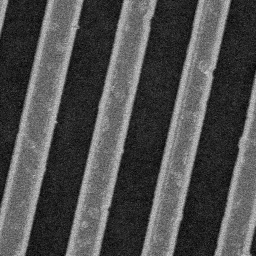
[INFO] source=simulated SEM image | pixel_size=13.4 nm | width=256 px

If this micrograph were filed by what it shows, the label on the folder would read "one or a few lines or trenches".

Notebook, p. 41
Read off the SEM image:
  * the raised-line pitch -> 0.971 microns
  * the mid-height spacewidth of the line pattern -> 627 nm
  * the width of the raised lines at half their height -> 360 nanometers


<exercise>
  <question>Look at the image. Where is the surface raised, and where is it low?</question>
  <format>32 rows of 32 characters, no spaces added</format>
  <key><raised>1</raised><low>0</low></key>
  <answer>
10000011110000001110000001110000
00000011110000011110000001110000
00000011100000011110000001110000
00000011100000011100000011110000
00000111100000011100000011100000
00000111100000011100000011100000
00000111100000111100000011100000
00000111000000111100000011100000
00000111000000111000000111000000
00001111000000111000000111000000
00001111000001111000000111000000
00001110000001111000000111000000
00011110000001110000001111000000
00011110000001110000001110000001
00011110000001110000001110000001
00011110000011110000001110000001
00011100000011110000001110000001
00111100000011100000011110000011
00111100000011100000011100000011
00111100000111100000011100000011
00111000000111100000011100000011
01111000000111000000111100000011
01111000000111000000111000000111
01111000001111000000111000000111
01110000001111000000111000000111
01110000001110000001111000000111
11110000001110000001110000000111
11110000001110000001110000001111
11110000011110000001110000001111
11100000011110000001110000001110
11100000011100000011110000001110
11100000011100000011100000011110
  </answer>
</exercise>